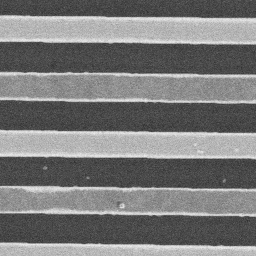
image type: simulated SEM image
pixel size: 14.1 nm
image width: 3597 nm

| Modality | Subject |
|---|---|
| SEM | lines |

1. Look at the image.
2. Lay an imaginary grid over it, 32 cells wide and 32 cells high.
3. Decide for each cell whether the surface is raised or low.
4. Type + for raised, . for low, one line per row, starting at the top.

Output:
................................
................................
++++++++++++++++++++++++++++++++
++++++++++++++++++++++++++++++++
++++++++++++++++++++++++++++++++
................................
................................
................................
................................
++++++++++++++++++++++++++++++++
++++++++++++++++++++++++++++++++
++++++++++++++++++++++++++++++++
...+++++++++++++++++++++++++++++
................................
................................
................................
++++++++++++++..................
++++++++++++++++++++++++++++++++
++++++++++++++++++++++++++++++++
++++++++++++++++++++++++++++++++
................................
................................
................................
+++++++++++++++.................
++++++++++++++++++++++++++++++++
++++++++++++++++++++++++++++++++
++++++++++++++++++++++++++++++++
................................
................................
................................
++..............................
++++++++++++++++++++++++++++++++